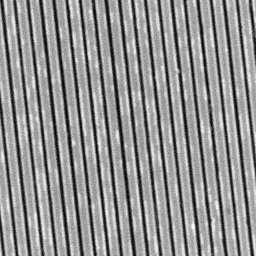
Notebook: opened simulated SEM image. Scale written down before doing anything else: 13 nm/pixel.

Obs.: parallel lines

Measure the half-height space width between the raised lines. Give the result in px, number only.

4.72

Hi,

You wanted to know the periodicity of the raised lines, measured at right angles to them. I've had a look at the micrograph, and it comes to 169 nanometres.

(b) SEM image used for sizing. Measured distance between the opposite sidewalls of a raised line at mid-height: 110 nm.